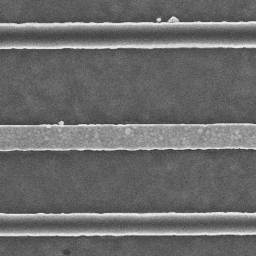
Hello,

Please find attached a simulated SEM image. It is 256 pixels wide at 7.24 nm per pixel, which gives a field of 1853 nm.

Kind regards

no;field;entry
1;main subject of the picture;lines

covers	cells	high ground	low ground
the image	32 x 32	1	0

00000000000000000000000000000000
00000000000000000000000000000000
00000000000000000000000000000000
11111111111111111111111111111111
11111111111111111111111111111111
11111111111111111111111111111111
00000000000000000000000000000000
00000000000000000000000000000000
00000000000000000000000000000000
00000000000000000000000000000000
00000000000000000000000000000000
00000000000000000000000000000000
00000000000000000000000000000000
00000000000000000000000000000000
00000000000000000000000000000000
00000000000000000000000000000000
11111111111111111111111111111111
11111111111111111111111111111111
11111111111111111111111111111111
00000000000000000000000000000000
00000000000000000000000000000000
00000000000000000000000000000000
00000000000000000000000000000000
00000000000000000000000000000000
00000000000000000000000000000000
00000000000000000000000000000000
00000000000000000000000000000000
11111111111111111111111111111111
11111111111111111111111111111111
00000000000000000000000000000000
00000000000000000000000000000000
00000000000000000000000000000000